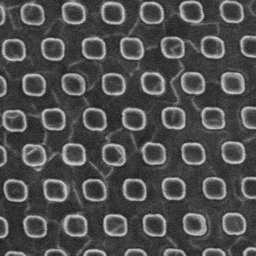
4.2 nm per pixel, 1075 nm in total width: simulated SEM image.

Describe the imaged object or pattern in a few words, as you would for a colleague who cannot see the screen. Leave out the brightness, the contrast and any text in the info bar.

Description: a regular array of raised bodies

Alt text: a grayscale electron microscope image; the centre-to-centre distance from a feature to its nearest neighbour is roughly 166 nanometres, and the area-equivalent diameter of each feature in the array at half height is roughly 96.4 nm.